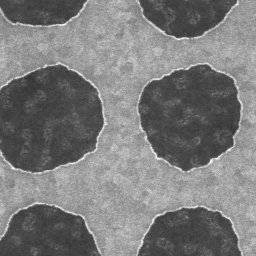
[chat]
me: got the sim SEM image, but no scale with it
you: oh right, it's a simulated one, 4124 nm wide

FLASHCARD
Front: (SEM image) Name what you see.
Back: holes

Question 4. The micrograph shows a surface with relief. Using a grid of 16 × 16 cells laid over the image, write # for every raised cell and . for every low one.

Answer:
.....####......#
#...######....##
################
################
##...######...##
......###......#
......###......#
......###......#
......###......#
......####....##
#..########.####
################
################
#....#####....##
......###......#
......###......#